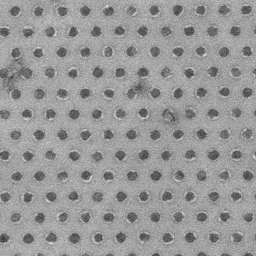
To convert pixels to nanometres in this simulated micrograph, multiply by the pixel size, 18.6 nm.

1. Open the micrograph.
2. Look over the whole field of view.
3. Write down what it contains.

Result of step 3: a regular array of raised bodies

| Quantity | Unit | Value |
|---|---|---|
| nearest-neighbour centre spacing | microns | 0.425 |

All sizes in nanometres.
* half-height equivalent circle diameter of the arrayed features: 216